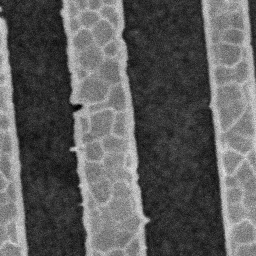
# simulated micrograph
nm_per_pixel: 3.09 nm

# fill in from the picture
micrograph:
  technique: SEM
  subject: one or a few lines or trenches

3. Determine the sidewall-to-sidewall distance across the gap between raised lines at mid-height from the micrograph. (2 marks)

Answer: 0.25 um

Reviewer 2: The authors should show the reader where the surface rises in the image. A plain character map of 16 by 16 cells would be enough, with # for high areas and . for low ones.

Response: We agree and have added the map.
....###......##.
....####.....##.
....####.....##.
....####.....###
.....###.....###
#....###.....###
#....###.....###
#....###......##
#....###......##
#....###......##
#....###......##
#....###......##
#....####.....##
#....####.....##
#.....###.....##
#.....###.....##